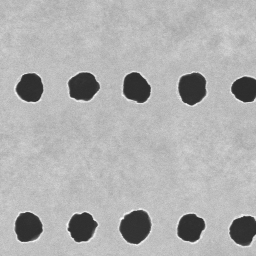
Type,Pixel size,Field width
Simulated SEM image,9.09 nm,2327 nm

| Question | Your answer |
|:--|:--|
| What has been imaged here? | a regular array of holes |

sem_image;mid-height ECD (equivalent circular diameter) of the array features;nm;256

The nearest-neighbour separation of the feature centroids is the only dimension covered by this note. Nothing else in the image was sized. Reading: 486 nm